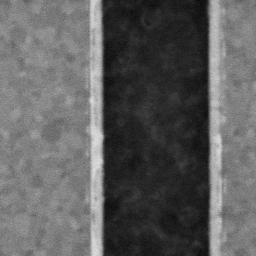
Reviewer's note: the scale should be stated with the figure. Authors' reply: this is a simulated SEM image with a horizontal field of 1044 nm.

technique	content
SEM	one or a few lines or trenches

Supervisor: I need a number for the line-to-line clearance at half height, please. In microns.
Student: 0.481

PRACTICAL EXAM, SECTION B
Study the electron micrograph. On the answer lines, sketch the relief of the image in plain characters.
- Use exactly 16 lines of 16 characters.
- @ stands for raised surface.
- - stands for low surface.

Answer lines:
@@@@@@-------@@@
@@@@@@-------@@@
@@@@@@-------@@@
@@@@@@-------@@@
@@@@@@-------@@@
@@@@@@-------@@@
@@@@@@-------@@@
@@@@@@-------@@@
@@@@@@-------@@@
@@@@@@-------@@@
@@@@@@-------@@@
@@@@@@-------@@@
@@@@@@-------@@@
@@@@@@-------@@@
@@@@@@-------@@@
@@@@@@-------@@@